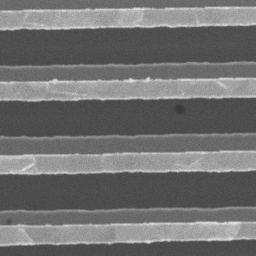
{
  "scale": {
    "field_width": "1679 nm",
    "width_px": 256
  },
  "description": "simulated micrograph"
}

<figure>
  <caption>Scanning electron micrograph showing lines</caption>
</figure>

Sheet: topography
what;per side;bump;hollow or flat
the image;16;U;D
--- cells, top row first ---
UUUUUUUUUUUUUUUU
UUUUUUUUUUUUUUUU
DDDDDDDDDDDDDDDD
DDDDDDDDDDDDDDDD
UUUUUUUUUUUUUUUU
UUUUUUUUUUUUUUUU
DDDDDDDDDDDDDDDD
DDDDDDDDDDDDDDDD
DDDDDDDUUUUUUUUU
UUUUUUUUUUUUUUUU
UUUUUUUUUUUUUUUU
DDDDDDDDDDDDDDDD
DDDDDDDDDDDDDDDD
UUUUUUUUUUUUUUUU
UUUUUUUUUUUUUUUU
DDDDDDDDDDDDDDDD